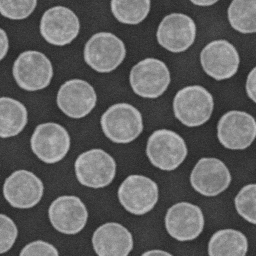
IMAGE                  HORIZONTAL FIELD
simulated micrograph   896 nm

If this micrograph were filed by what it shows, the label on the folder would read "a regular array of raised bodies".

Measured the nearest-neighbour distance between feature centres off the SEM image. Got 0.181 micrometres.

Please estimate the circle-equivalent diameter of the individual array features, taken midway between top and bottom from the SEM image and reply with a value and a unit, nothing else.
133 nanometers